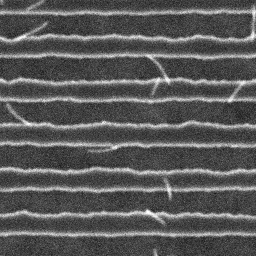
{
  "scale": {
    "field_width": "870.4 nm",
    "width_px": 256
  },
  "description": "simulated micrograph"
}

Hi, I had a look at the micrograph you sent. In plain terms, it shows lines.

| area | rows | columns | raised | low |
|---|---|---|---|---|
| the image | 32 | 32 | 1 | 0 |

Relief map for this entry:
11111111111111111111111111111111
11111111111111111111111111111111
00000000000000000000000000000000
00000000000000000000000000000000
00010111110001101100000011000001
11111111111111111111111111111111
11111111111111111111111111111111
00000000000000000000000000000000
00000000000000000000000000000000
00000000000000000000000000000000
11111111111111111111111111111111
11111111111111111111111111111111
11111111111111111111111101111111
00000000000000000000000000000000
00000000000000000000000000000000
01111100000111100000000111100000
11111111111111111111111111111111
11111111111111111111111111111111
00000000000000000000000000000000
00000000000000000000000000000000
00000000000000000000000000000000
11111111111111111111111111101111
11111111111111111111111111111111
11111111111111111111111111111111
00000000000000000000000000000000
00000000000000000000000000000000
00100000000000000010000000000000
11111111111111111111111111111111
11111111111111111111111111111111
00000000010001100000010011000000
00000000000000000000000000000000
00000000000000000000000000000000